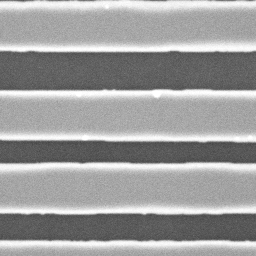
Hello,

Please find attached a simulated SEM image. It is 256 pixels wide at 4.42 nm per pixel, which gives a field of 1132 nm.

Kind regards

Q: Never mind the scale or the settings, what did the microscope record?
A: lines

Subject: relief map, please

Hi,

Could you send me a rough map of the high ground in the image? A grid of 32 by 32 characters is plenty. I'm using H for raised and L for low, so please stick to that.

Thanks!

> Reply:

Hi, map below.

HHHHHHHHHHHHHHHHHHHHHHHHHHHHHHHH
HHHHHHHHHHHHHHHHHHHHHHHHHHHHHHHH
HHHHHHHHHHHHHHHHHHHHHHHHHHHHHHHH
HHHHHHHHHHHHHHHHHHHHHHHHHHHHHHHH
HHHHHHHHHHHHHHHHHHHHHHHHHHHHHHHH
HHHHHHHHHHHHHHHHHHHHHHHHHHHHHHHH
LLLLLLLLLLLLLLLLLLLLLLLLLLLLLLLL
LLLLLLLLLLLLLLLLLLLLLLLLLLLLLLLL
LLLLLLLLLLLLLLLLLLLLLLLLLLLLLLLL
LLLLLLLLLLLLLLLLLLLLLLLLLLLLLLLL
LLLLLLLLLLLLLLLLLLLLLLLLLLLLLLLL
HHLLHHHHHHHHHHHHHHHHHHHHHHHHHHHH
HHHHHHHHHHHHHHHHHHHHHHHHHHHHHHHH
HHHHHHHHHHHHHHHHHHHHHHHHHHHHHHHH
HHHHHHHHHHHHHHHHHHHHHHHHHHHHHHHH
HHHHHHHHHHHHHHHHHHHHHHHHHHHHHHHH
HHHHHHHHHHHHHHHHHHHHHHHHHHHHHHHH
LLLLLLLLLLLLLHHLLLLLLHHHHHHHHHHH
LLLLLLLLLLLLLLLLLLLLLLLLLLLLLLLL
LLLLLLLLLLLLLLLLLLLLLLLLLLLLLLLL
LLLLLLHHHLLHHHLLLLLLLLLLHHHHLLLL
HHHHHHHHHHHHHHHHHHHHHHHHHHHHHHHH
HHHHHHHHHHHHHHHHHHHHHHHHHHHHHHHH
HHHHHHHHHHHHHHHHHHHHHHHHHHHHHHHH
HHHHHHHHHHHHHHHHHHHHHHHHHHHHHHHH
HHHHHHHHHHHHHHHHHHHHHHHHHHHHHHHH
HHHHHHHHHHHHHHHHLHHHHHHHHHHHHHHH
LLLLLLLLLLLLLLLLLLLLLLLLLLLLLLLL
LLLLLLLLLLLLLLLLLLLLLLLLLLLLLLLL
LLLLLLLLLLLLLLLLLLLLLLLLLLLLLLLL
HHHHHHHHHHHHHHHHHHHHHHHHHHHHHHHH
HHHHHHHHHHHHHHHHHHHHHHHHHHHHHHHH